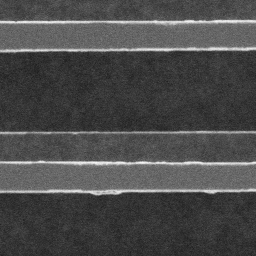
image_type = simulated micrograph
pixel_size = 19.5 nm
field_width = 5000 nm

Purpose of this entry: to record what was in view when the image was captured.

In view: lines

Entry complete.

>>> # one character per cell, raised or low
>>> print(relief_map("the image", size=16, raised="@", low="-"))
@@@@@@@@@@@@@@@@
@@@@@@@@@@@@@@@@
@@@@@@@@@@@@@@@@
----------------
----------------
----------------
----------------
----------------
@@@@@@@@@@@@@@@@
@@@@@@@@@@@@@@@@
@@@@@@@@@@@@@@@@
@@@@@@@@@@@@@@@@
----------------
----------------
----------------
----------------